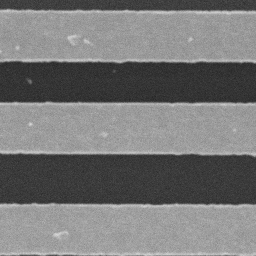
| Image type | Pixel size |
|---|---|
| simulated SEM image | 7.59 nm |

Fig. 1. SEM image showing lines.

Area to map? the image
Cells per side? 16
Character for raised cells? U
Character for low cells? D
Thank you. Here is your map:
DDDDDDDDDDDDDDDD
UUUUUUUUUUUUUUUU
UUUUUUUUUUUUUUUU
UUUUUUUUUUUUUUUU
DDDDDDDDDDDDDDDD
DDDDDDDDDDDDDDDD
UUUUUUUUUUUUUUUD
UUUUUUUUUUUUUUUU
UUUUUUUUUUUUUUUU
UUUUUUUUUUUUUUUU
DDDDDDDDDDDDDDDD
DDDDDDDDDDDDDDDD
DDDDDDDDDDDDDDDD
UUUUUUUUUUUUUUUU
UUUUUUUUUUUUUUUU
UUUUUUUUUUUUUUUU